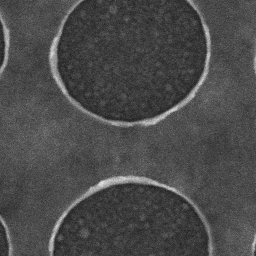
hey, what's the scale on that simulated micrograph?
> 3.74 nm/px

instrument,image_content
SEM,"holes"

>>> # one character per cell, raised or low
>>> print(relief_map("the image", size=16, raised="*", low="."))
*****.......****
****.........***
****.........***
***..........***
****.........***
****........****
*****......*****
*******..*******
****************
****************
****************
*******..*******
*****.......****
****.........***
****.........***
.**..........***